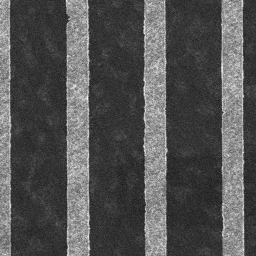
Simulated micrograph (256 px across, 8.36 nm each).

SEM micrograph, one or a few lines or trenches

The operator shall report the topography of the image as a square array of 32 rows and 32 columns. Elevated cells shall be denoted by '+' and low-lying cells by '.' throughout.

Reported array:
+.......+++.......+++.......++..
+.......+++.......+++.......++..
+........++.......+++.......++..
+.......+++.......+++.......++..
+.......+++.......+++.......++..
+.......+++.......+++.......++..
+.......+++.......+++.......++..
+.......+++.......+++.......++..
+.......+++.......+++.......++..
+.......+++.......+++.......++..
+.......+++.......+++.......++..
+.......+++.......+++.......++..
+.......+++.......+++.......++..
+.......+++.......+++.......++..
+.......+++.......+++.......++..
+.......+++.......+++.......++..
+.......+++.......+++.......++..
+.......+++.......+++.......++..
+.......+++.......+++.......++..
+.......+++.......+++.......++..
+.......+++.......+++.......++..
+.......+++.......+++.......++..
+.......+++.......+++.......++..
+.......+++.......+++.......++..
+.......+++.......+++.......++..
+.......+++.......+++.......++..
+.......+++.......+++.......++..
+........++.......+++.......++..
+.......+++.......+++.......++..
+.......+++.......+++.......++..
+.......+++.......+++.......++..
+.......+++.......+++.......++..